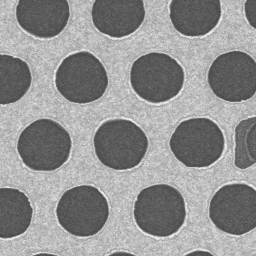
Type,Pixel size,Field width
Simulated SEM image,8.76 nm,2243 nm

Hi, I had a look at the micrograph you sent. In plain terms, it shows holes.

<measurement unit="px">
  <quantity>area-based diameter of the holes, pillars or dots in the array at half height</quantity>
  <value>51.6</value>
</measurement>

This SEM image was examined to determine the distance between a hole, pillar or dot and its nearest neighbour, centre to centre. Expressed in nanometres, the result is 664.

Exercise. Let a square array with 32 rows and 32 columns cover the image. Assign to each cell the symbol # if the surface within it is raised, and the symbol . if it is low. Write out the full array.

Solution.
##.......###......###.......###.
##.......##.......###.......###.
##.......###......###......####.
###.....####.....#####.....#####
#####..#######..################
################################
##########.##################.##
...#####....#####.....#####.....
....###......###.......###......
....###......###.......###......
....###......###.......###......
...####......####.....#####.....
..#######...######...#######...#
################################
################################
####...######....######....###..
###.....####......####......#...
##.......###......###.......#...
##.......###......###.......#...
###......###......####......#...
###.....#####....######...###...
################################
################################
.########...######....######...#
...#####.....####......####.....
....###......####......###......
....###.......###......###......
....###......####......###......
...#####.....####.....#####.....
..########.########..###########
################################
########################..######